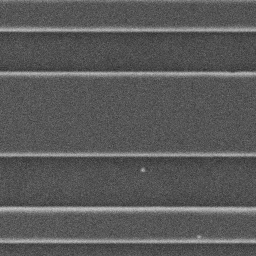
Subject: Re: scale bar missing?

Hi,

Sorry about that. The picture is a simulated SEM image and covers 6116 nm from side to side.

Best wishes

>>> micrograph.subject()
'lines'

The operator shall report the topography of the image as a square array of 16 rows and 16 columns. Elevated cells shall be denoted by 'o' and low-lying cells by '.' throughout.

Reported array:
oooooooooooooooo
oooooooooooooooo
................
................
................
oooooooooooooooo
oooooooooooooooo
oooooooooooooooo
oooooooooooooooo
oooooooooooooooo
................
................
................
oooooooooooooooo
oooooooooooooooo
................